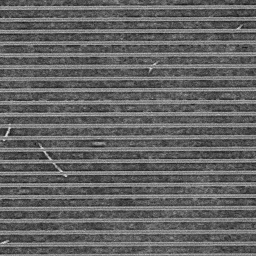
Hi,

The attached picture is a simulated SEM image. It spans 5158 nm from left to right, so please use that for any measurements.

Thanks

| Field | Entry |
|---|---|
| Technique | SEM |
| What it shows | parallel lines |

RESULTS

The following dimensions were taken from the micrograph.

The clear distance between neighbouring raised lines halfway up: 8.38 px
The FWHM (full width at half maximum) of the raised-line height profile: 68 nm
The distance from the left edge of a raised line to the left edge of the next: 238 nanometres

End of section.